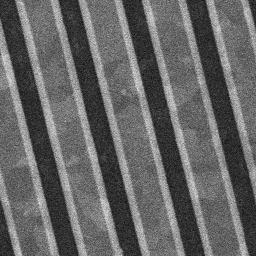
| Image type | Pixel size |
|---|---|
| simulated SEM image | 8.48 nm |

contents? one or a few lines or trenches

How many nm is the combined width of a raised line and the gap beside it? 521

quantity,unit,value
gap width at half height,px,24.7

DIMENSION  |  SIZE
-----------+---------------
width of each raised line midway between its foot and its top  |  306 nanometres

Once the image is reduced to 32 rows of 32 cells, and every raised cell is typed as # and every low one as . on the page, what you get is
..#####...#####...#####...#####.
...####....####...#####...#####.
...####....####....####....####.
...#####...#####...#####...#####
...#####...#####...#####...#####
....####....####...#####...#####
#...#####...####....####....####
#...#####...#####...#####...####
#...#####...#####...#####...####
#....####....####...#####...####
##...#####...####....####....###
##...#####...#####...#####...###
##...#####...#####...#####...###
##....####....####...#####...###
###...#####...####....####....##
###...#####...#####...#####...##
###...#####...#####...#####...##
###....####....####...#####...##
####...#####...####....####....#
####...#####...#####...#####...#
####...#####...#####...#####...#
####....####....####...#####...#
#####...#####...####....####....
#####...#####...#####...#####...
#####...#####...#####...#####...
.####....####...#####...#####...
.#####...#####...####....####...
.#####...#####...#####...#####..
.#####...#####...#####...#####..
..####....####...#####...#####..
..#####...#####...####....####..
..#####...#####...#####...#####.